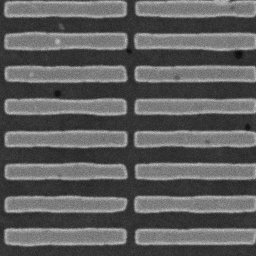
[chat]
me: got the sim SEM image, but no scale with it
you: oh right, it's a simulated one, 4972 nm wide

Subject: wiring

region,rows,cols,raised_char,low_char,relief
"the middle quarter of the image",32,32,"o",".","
................................
ooooooooooooooo...oooooooooooooo
oooooooooooooooo..oooooooooooooo
oooooooooooooooo..oooooooooooooo
................................
................................
................................
................................
................................
ooooooooooooooo...oooooooooooooo
oooooooooooooooo..oooooooooooooo
oooooooooooooooo..oooooooooooooo
.......oooooooo...ooooo.oooooooo
................................
................................
................................
................................
oooooooooooooooo..oooooooooooooo
oooooooooooooooo..oooooooooooooo
oooooooooooooooo..oooooooooooooo
ooooooooo.........oooo..........
................................
................................
................................
................................
ooooooooooooooo...oooooooooooooo
oooooooooooooooo..oooooooooooooo
oooooooooooooooo..oooooooooooooo
ooooooooo...ooo...ooooooooooo...
................................
................................
................................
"